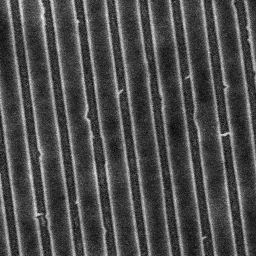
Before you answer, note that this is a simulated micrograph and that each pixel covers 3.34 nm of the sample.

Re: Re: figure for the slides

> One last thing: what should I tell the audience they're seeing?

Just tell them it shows parallel lines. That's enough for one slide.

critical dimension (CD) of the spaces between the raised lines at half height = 33.9 nanometres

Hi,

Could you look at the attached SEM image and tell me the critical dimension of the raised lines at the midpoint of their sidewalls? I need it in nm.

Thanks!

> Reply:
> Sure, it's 71.1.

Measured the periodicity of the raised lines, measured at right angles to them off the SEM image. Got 32 px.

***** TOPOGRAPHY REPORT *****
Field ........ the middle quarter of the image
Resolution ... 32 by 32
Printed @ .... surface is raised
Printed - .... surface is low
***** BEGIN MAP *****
@@@@---@@@@@@--@@@@@@--@@@@@@--@
@@@@@--@@@@@@--@@@@@@--@@@@@@--@
@@@@@--@@@@@@---@@@@@--@@@@@@--@
@@@@@---@@@@@---@@@@@---@@@@@---
@@@@@---@@@@@---@@@@@---@@@@@---
@@@@@---@@@@@---@@@@@---@@@@@---
@@@@@---@@@@@---@@@@@---@@@@@---
@@@@@---@@@@@@--@@@@@---@@@@@@--
@@@@@---@@@@@@--@@@@@@---@@@@@--
@@@@@@--@@@@@@--@@@@@@---@@@@@--
@@@@@@--@@@@@@---@@@@@---@@@@@--
-@@@@@---@@@@@---@@@@@---@@@@@--
-@@@@@---@@@@@---@@@@@---@@@@@--
-@@@@@---@@@@@---@@@@@---@@@@@--
-@@@@@---@@@@@---@@@@@---@@@@@@-
-@@@@@---@@@@@---@@@@@---@@@@@@-
-@@@@@@--@@@@@---@@@@@@--@@@@@@-
-@@@@@@--@@@@@@---@@@@@--@@@@@@-
--@@@@@---@@@@@---@@@@@---@@@@@-
--@@@@@---@@@@@---@@@@@---@@@@@-
--@@@@@---@@@@@---@@@@@---@@@@@-
--@@@@@---@@@@@---@@@@@---@@@@@-
--@@@@@---@@@@@---@@@@@---@@@@@@
--@@@@@---@@@@@---@@@@@@--@@@@@@
--@@@@@@---@@@@@--@@@@@@--@@@@@@
---@@@@@---@@@@@---@@@@@---@@@@@
---@@@@@---@@@@@---@@@@@---@@@@@
---@@@@@---@@@@@---@@@@@---@@@@@
---@@@@@---@@@@@---@@@@@---@@@@@
---@@@@@---@@@@@---@@@@@@--@@@@@
---@@@@@---@@@@@---@@@@@@--@@@@@
@--@@@@@@--@@@@@---@@@@@@--@@@@@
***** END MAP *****